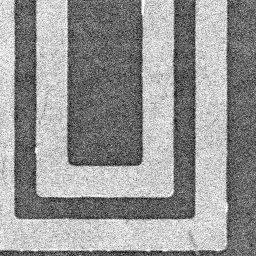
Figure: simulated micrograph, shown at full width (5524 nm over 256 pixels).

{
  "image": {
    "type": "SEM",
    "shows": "groups of lines, slits or small figures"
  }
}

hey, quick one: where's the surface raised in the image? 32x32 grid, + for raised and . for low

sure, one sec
++...+++..........++++...+++....
++...+++..........++++...+++....
++...+++..........++++...+++....
++...+++..........++++...+++....
++...+++..........++++...+++....
++...+++..........++++...+++....
++...+++..........++++...+++....
++...+++..........++++...+++....
++...+++..........++++...+++....
++...+++..........++++...+++....
++...+++..........++++...+++....
++...+++..........++++...+++....
++...+++..........++++...+++....
++...+++..........++++...+++....
++...+++..........++++...+++....
++...+++..........++++...+++....
++...+++..........++++...+++....
++...+++..........++++...+++....
++...+++..........++++...+++....
++...+++..........++++...+++....
++...++++.........++++...+++....
++...+++++++++++++++++...+++....
++...+++++++++++++++++...+++....
++...+++++++++++++++++...+++....
++...+++++..+++++++++....+++....
++.......................+++....
++......................++++....
+++....++++.......++++++++++....
++++++++++++++++++++++++++++....
++++++++++++++++++++++++++++....
++++++++++++++++++++++++++++....
................................